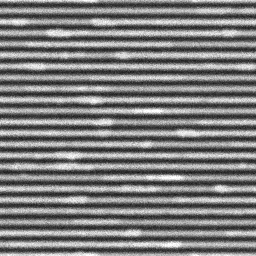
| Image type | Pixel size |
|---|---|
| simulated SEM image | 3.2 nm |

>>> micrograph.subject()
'parallel lines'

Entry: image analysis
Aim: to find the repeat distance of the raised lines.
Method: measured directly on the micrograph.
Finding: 35.6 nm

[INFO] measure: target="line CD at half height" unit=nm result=14.8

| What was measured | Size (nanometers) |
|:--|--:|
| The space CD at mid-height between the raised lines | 20.4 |